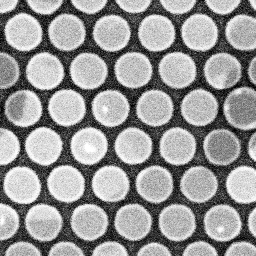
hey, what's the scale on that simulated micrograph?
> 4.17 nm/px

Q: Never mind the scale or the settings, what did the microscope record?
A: a regular array of raised bodies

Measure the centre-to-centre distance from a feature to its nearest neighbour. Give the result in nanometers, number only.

181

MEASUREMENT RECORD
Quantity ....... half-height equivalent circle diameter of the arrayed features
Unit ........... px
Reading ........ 35.6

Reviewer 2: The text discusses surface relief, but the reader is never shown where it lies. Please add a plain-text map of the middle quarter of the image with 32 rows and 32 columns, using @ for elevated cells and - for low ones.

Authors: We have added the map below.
--@@@@@@@@---@@@@@@@@@--@@@@@@@@
--@@@@@@@@@--@@@@@@@@@--@@@@@@@@
--@@@@@@@@@--@@@@@@@@@--@@@@@@@@
--@@@@@@@@---@@@@@@@@---@@@@@@@@
---@@@@@@@----@@@@@@@----@@@@@@@
----@@@@--------@@@--------@@@--
--------------------------------
@@@------@@@@@------@@@@@------@
@@@@----@@@@@@@----@@@@@@@----@@
@@@@@--@@@@@@@@@---@@@@@@@@---@@
@@@@@--@@@@@@@@@--@@@@@@@@@---@@
@@@@@--@@@@@@@@@--@@@@@@@@@--@@@
@@@@@---@@@@@@@@--@@@@@@@@@---@@
@@@@----@@@@@@@----@@@@@@@@---@@
@@@------@@@@@@-----@@@@@@-----@
--------------------------------
----@@@@-------@@@@--------@@@--
---@@@@@@-----@@@@@@-----@@@@@@-
--@@@@@@@@---@@@@@@@@----@@@@@@@
--@@@@@@@@@--@@@@@@@@@--@@@@@@@@
--@@@@@@@@@--@@@@@@@@@--@@@@@@@@
--@@@@@@@@@--@@@@@@@@@--@@@@@@@@
--@@@@@@@@---@@@@@@@@---@@@@@@@@
---@@@@@@-----@@@@@@@----@@@@@@@
----@@@@--------@@@--------@@@@-
--------------------------------
@@@------@@@@@------@@@@@------@
@@@@----@@@@@@@----@@@@@@@----@@
@@@@@--@@@@@@@@@---@@@@@@@@---@@
@@@@@--@@@@@@@@@--@@@@@@@@@--@@@
@@@@@--@@@@@@@@@--@@@@@@@@@--@@@
@@@@@---@@@@@@@@---@@@@@@@@---@@